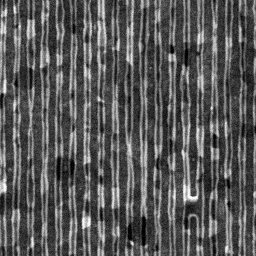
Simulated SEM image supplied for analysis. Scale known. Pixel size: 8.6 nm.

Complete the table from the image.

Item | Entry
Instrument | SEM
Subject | parallel lines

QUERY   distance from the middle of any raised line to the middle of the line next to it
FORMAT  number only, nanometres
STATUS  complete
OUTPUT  121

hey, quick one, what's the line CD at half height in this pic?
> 45.1 nanometres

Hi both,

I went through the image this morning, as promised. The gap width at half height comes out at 76.3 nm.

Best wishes